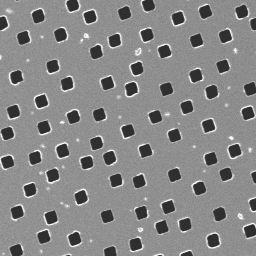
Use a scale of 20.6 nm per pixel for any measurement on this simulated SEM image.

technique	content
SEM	a regular array of holes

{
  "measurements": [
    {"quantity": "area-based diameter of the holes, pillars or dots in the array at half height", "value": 268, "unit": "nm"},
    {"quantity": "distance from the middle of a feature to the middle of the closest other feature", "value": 534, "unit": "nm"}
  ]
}